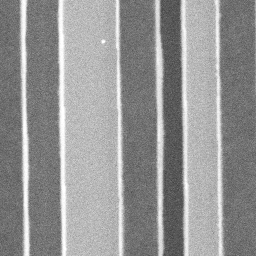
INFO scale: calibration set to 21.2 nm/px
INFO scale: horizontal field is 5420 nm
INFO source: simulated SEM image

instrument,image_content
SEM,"lines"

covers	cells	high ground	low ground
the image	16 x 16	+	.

+...++++++..++++
+...++++++..++++
+...++++++..++++
+...++++++..++++
+...++++++..++++
+...++++++..++++
+...++++++..++++
++..++++++..++++
++..++++++..++++
++..++++++..++++
++..++++++..++++
++..++++++..++++
++..++++++..++++
++..++++++..++++
++..++++++..++++
++..++++++..++++